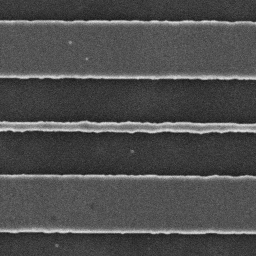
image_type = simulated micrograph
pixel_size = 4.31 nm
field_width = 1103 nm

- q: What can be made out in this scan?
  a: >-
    lines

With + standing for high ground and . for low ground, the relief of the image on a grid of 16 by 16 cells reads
................
++++++++++++++++
++++++++++++++++
++++++++++++++++
++++++++++++++++
................
................
................
................
................
................
++++++++++++++++
++++++++++++++++
++++++++++++++++
++++++++++++++++
................